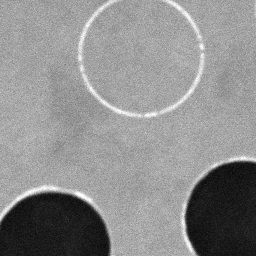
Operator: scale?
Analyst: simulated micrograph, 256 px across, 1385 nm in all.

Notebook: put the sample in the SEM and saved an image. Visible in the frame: holes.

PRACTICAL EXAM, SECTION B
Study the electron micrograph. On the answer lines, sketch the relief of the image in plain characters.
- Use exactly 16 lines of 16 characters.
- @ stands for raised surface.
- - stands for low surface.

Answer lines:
@@@@@@@@@@@@@@@@
@@@@@@@@@@@@@@@@
@@@@@@@@@@@@@@@@
@@@@@@@@@@@@@@@@
@@@@@@@@@@@@@@@@
@@@@@@@@@@@@@@@@
@@@@@@@@@@@@@@@@
@@@@@@@@@@@@@@@@
@@@@@@@@@@@@@@@@
@@@@@@@@@@@@@@@@
@@@@@@@@@@@@@---
@@@@@@@@@@@@----
@----@@@@@@@----
------@@@@@@----
-------@@@@@----
-------@@@@@----